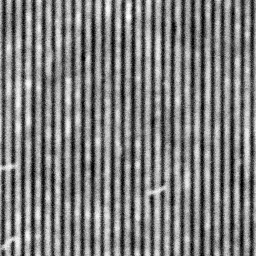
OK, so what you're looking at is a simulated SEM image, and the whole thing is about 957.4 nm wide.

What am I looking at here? parallel lines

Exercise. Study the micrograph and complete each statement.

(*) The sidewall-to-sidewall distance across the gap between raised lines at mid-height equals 19.2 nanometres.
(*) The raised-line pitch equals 37.2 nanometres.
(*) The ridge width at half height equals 15.9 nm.